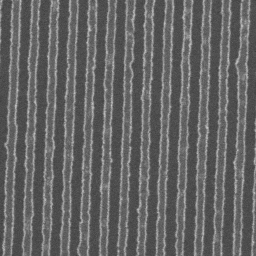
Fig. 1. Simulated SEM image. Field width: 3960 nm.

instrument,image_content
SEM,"parallel lines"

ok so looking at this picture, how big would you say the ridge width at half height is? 120 nm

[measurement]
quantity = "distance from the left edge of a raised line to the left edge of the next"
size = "295 nm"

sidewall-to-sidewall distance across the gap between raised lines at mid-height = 172 nanometers